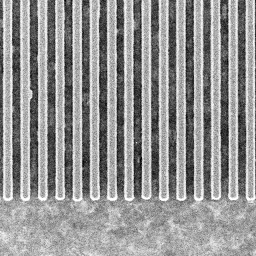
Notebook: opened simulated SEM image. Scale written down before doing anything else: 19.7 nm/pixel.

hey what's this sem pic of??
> parallel lines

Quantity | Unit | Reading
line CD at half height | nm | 157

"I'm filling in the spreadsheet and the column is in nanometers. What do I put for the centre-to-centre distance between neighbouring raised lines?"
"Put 341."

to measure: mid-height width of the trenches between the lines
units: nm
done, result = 174